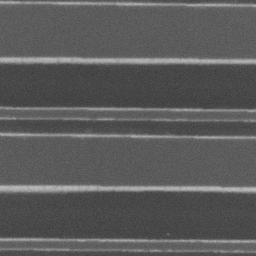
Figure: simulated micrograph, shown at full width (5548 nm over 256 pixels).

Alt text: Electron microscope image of lines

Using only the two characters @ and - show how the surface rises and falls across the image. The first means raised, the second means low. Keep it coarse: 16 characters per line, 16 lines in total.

@@@@@@@@@@@@@@@@
@@@@@@@@@@@@@@@@
@@@@@@@@@@@@@@@@
@@@@@@@@@@@@@@@@
----------------
----------------
----------------
@@@@@@@@@@@@@@@@
@@@@@@@@@@@@@@@@
@@@@@@@@@@@@@@@@
@@@@@@@@@@@@@@@@
@@@@@@@@@@@@@@@@
----------------
----------------
----------------
@@@@@@@@@@@@@@@@